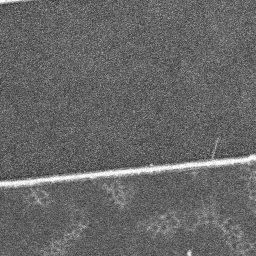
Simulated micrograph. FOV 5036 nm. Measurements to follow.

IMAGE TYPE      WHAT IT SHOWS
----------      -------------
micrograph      one or a few lines or trenches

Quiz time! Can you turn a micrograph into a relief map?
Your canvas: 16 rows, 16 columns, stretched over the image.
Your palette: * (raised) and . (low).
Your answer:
................
................
................
................
................
................
................
................
................
................
...........*****
****************
****************
****************
****************
****************